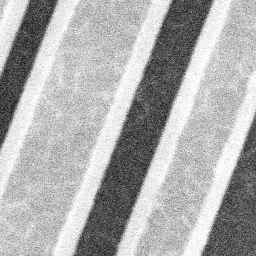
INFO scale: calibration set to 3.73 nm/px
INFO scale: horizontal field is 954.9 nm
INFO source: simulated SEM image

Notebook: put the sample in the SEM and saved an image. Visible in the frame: one or a few lines or trenches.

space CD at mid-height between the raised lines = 0.208 um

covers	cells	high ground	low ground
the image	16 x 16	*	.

*...******....**
*...******...***
...******....***
...******....***
..******....****
..******....****
..******...*****
.******....****.
.******....****.
.*****....*****.
******....****..
******...*****..
*****....****...
*****....****...
*****...*****...
****....****....